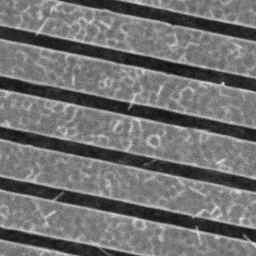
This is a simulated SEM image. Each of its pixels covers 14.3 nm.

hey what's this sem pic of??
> parallel lines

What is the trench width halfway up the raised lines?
13.6 px